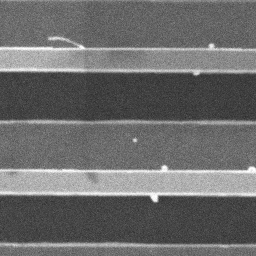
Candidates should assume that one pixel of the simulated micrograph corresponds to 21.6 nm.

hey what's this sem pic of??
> lines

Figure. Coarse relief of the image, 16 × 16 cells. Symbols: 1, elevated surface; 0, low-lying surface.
1111111111111111
1111111111111111
1111111111111111
1111111111111111
0000000000001011
0000000000000000
0000000000000000
0000000000000000
1111111111111111
1111111111111111
1111111111111111
1111111111111111
0000000000000000
0000000000000000
0000000000000000
1111111111111111